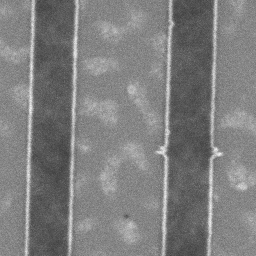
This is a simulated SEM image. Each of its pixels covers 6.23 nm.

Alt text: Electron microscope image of one or a few lines or trenches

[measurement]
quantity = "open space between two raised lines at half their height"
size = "580 nm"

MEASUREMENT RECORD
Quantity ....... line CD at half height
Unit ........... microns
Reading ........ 0.279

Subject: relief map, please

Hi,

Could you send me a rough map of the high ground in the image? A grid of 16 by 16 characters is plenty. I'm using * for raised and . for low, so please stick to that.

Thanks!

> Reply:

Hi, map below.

..***......**...
..***......**...
..***......**...
..***......**...
..***......**...
..***.....***...
..***.....***...
..***.....***...
..***.....***...
..***.....***...
..**......***...
..***.....***...
..**......***...
..**......***...
..**......***...
..**......***...